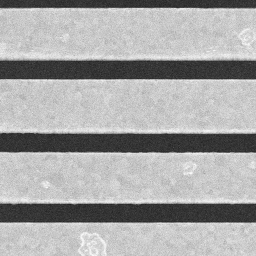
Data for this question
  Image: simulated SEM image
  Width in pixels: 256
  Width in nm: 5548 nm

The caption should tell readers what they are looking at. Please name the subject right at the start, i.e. lines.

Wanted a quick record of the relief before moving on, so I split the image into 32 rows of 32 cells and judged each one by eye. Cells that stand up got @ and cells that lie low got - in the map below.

--------------------------------
@@@@@@@@@@@@@@@@@@@@@@@@@@@@@@@@
@@@@@@@@@@@@@@@@@@@@@@@@@@@@@@@@
@@@@@@@@@@@@@@@@@@@@@@@@@@@@@@@@
@@@@@@@@@@@@@@@@@@@@@@@@@@@@@@@@
@@@@@@@@@@@@@@@@@@@@@@@@@@@@@@@@
@@@@@@@@@@@@@@@@@@@@@@@@@@@@@@@@
--------@@@@-@@@@--@@@@@@@@----@
--------------------------------
--------------------------------
@@@@@@@@@@@@@@@@@@@@@@@@@@@@@@@@
@@@@@@@@@@@@@@@@@@@@@@@@@@@@@@@@
@@@@@@@@@@@@@@@@@@@@@@@@@@@@@@@@
@@@@@@@@@@@@@@@@@@@@@@@@@@@@@@@@
@@@@@@@@@@@@@@@@@@@@@@@@@@@@@@@@
@@@@@@@@@@@@@@@@@@@@@@@@@@@@@@@@
@@@@@@@@@@@@@@@@@@@@@@@@@@@@@@@@
--------------------------------
--------------------------------
@@@@@@@@@@@@@@@@@@@@@@@@@@@@@@@@
@@@@@@@@@@@@@@@@@@@@@@@@@@@@@@@@
@@@@@@@@@@@@@@@@@@@@@@@@@@@@@@@@
@@@@@@@@@@@@@@@@@@@@@@@@@@@@@@@@
@@@@@@@@@@@@@@@@@@@@@@@@@@@@@@@@
@@@@@@@@@@@@@@@@@@@@@@@@@@@@@@@@
--------------------------------
--------------------------------
--------------------------------
@@@@@@@@@@@@@@@@@@@@@@@@@@@@@@@@
@@@@@@@@@@@@@@@@@@@@@@@@@@@@@@@@
@@@@@@@@@@@@@@@@@@@@@@@@@@@@@@@@
@@@@@@@@@@@@@@@@@@@@@@@@@@@@@@@@